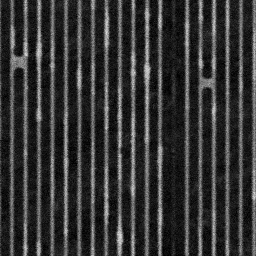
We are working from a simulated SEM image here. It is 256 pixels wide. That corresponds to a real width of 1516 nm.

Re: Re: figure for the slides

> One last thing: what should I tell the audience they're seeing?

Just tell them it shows parallel lines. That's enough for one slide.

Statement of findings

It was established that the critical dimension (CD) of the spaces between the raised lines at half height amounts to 64.4 nm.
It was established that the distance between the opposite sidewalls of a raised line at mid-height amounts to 14.1 nanometres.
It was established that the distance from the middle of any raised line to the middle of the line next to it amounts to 79.6 nm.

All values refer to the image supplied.